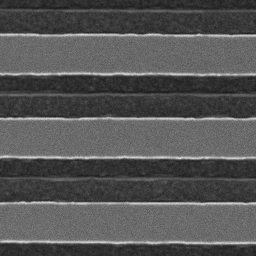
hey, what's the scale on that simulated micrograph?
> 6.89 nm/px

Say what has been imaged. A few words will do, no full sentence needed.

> lines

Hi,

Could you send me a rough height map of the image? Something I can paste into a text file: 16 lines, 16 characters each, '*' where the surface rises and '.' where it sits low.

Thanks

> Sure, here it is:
................
................
****************
****************
****************
................
................
****************
****************
****************
................
................
................
****************
****************
................